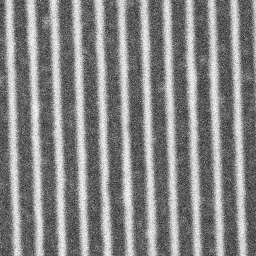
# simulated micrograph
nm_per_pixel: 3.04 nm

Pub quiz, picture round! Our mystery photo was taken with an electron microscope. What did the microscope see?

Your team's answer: parallel lines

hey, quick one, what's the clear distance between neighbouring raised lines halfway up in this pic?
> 16.1 pixels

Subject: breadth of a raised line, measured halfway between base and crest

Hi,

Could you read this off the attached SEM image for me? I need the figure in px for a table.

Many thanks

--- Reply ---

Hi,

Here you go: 6.74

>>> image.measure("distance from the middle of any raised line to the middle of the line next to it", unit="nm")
68.4